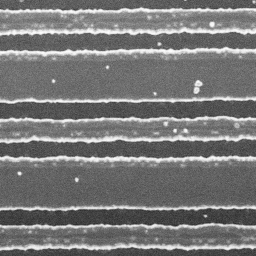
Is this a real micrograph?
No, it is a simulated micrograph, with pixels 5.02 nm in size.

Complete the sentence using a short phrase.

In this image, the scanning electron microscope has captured lines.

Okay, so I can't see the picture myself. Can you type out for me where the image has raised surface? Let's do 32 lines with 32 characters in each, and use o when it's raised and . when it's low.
................................
oooooooooooooooooooooooooooooooo
oooooooooooooooooooooooooooooooo
oooooooooooooooooooooooooooooooo
................................
................................
.o.o....o.oo.ooooooooooooooooooo
oooooooooooooooooooooooooooooooo
oooooooooooooooooooooooooooooooo
oooooooooooooooooooooooooooooooo
oooooooooooooooooooooooooooooooo
oooooooooooooooooooooooooooooooo
oooooooooooooooooooooooooo......
................................
................................
oooooooooooooooooooooooooooooooo
oooooooooooooooooooooooooooooooo
oooo..oooooooo.oo.oooo.......o..
................................
................................
oooooooooooooooooooooooooooooooo
oooooooooooooooooooooooooooooooo
oooooooooooooooooooooooooooooooo
oooooooooooooooooooooooooooooooo
oooooooooooooooooooooooooooooooo
oooooooooooooooooooooooooooooooo
................................
................................
oooooooooooooooooooooooooooooooo
oooooooooooooooooooooooooooooooo
oooooooooooooooooooooooooooooooo
................................